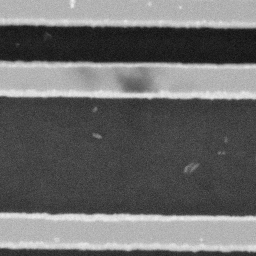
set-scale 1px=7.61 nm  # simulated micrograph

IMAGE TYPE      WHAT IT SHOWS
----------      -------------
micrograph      lines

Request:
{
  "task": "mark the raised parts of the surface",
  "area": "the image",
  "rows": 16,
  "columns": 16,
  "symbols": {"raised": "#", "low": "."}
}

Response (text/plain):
################
################
................
................
################
################
................
................
................
................
................
................
................
#########.......
################
...#############